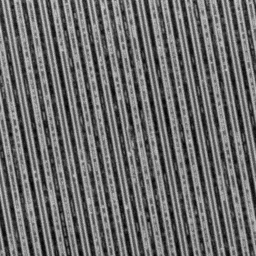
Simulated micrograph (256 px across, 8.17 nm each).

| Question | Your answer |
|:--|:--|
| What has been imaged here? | parallel lines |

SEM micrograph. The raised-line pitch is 98.3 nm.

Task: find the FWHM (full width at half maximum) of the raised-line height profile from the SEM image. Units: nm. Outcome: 36.2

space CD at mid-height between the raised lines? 57.3 nm